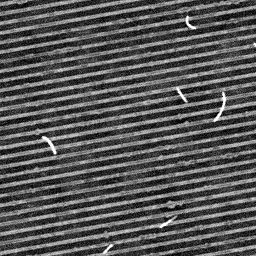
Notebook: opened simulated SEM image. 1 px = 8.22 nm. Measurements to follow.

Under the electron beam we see parallel lines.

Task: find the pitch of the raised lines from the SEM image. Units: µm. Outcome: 0.0775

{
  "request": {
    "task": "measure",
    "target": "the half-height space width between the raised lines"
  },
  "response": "55.7 nm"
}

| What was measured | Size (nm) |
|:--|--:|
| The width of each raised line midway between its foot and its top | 24.3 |